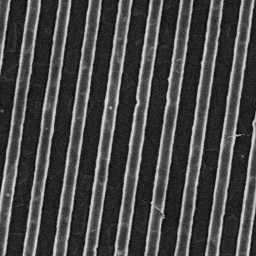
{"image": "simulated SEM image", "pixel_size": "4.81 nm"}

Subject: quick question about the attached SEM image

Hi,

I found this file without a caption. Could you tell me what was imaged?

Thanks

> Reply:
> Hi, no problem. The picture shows parallel lines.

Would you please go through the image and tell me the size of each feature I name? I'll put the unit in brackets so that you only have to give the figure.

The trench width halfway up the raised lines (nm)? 88.1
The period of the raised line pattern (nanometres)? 145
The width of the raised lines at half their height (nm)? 54.8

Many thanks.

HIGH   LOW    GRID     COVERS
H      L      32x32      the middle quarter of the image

LLLLHHHLLLLLHHHLLLLLHHLLLLLHHHLL
LLLLHHHLLLLLHHLLLLLHHHLLLLLHHHLL
LLLLHHHLLLLLHHLLLLLHHHLLLLLHHHLL
LLLLHHHLLLLHHHLLLLLHHHLLLLHHHHLL
LLLLHHLLLLLHHHLLLLLHHHLLLLHHHLLL
LLLHHHLLLLLHHHLLLLLHHHLLLLHHHLLL
LLLHHHLLLLLHHHLLLLHHHLLLLLHHHLLL
LLLHHHLLLLLHHHLLLLHHHLLLLLHHHLLL
LLLHHHLLLLLHHLLLLLHHHLLLLLHHHLLL
LLLHHHLLLLLHHLLLLLHHHLLLLLHHHLLL
LLLHHHLLLLHHHLLLLLHHHLLLLLHHLLLL
LLLHHLLLLLHHHLLLLLHHHLLLLHHHLLLL
LLHHHLLLLLHHHLLLLLHHHLLLLHHHLLLL
LLHHHLLLLLHHHLLLLLHHLLLLLHHHLLLL
LLHHHLLLLLHHHLLLLLHHLLLLLHHHLLLL
LLHHHLLLLLHHHLLLLHHHLLLLLHHHLLLL
LLHHHLLLLLHHLLLLLHHHLLLLLHHLLLLL
LLHHHLLLLHHHLLLLLHHHLLLLLHHLLLLL
LLHHLLLLLHHHLLLLLHHHLLLLHHHLLLLL
LLHHLLLLLHHHLLLLLHHHLLLLHHHLLLLL
LHHHLLLLLHHHLLLLHHHLLLLLHHHLLLLL
LHHHLLLLLHHHLLLLHHHLLLLLHHHLLLLL
LHHHLLLLLHHLLLLLHHHLLLLLHHHLLLLL
LHHHLLLLLHHLLLLLHHHLLLLLHHHLLLLH
LHHHLLLLHHHLLLLLHHHLLLLLHHHLLLLH
LHHLLLLLHHHLLLLLHHHLLLLHHHLLLLLH
LHHLLLLLHHHLLLLLHHHLLLLHHHLLLLLH
HHHLLLLLHHHLLLLHHHLLLLLHHHLLLLLH
HHHLLLLLHHHLLLLHHHLLLLLHHHLLLLLH
HHHLLLLLHHLLLLLHHHLLLLLHHHLLLLLH
HHHLLLLLHHLLLLLHHHLLLLLHHHLLLLHH
HHHLLLLHHHLLLLLHHHLLLLHHHHLLLLHH